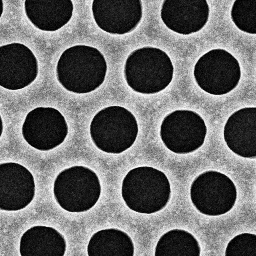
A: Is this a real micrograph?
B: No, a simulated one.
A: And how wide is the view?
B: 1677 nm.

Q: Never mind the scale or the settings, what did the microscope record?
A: a regular array of holes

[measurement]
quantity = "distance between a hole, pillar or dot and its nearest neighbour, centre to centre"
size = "446 nm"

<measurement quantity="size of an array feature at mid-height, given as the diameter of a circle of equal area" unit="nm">308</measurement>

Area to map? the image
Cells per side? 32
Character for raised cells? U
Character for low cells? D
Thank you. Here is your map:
UUUDDDDDDUUUDDDDDDUUDDDDDDUUUDDD
UUUDDDDDDUUUDDDDDDUUDDDDDDUUUDDD
UUUUDDDDDUUUDDDDDDUUDDDDDDUUUDDD
UUUUUDDUUUUUUDDDDUUUUDDDDUUUUUDD
UUUUUUUUUUUUUUUUUUUUUUUUUUUUUUUU
UDDUUUUUUUUUUUUUUUUUUUUUUUUUUUUU
DDDDUUUUDDDDUUUUUDDDDUUUUUDDUUUU
DDDDDUUDDDDDDUUUDDDDDUUUUDDDDDUU
DDDDDUUDDDDDDUUUDDDDDDUUDDDDDDUU
DDDDDUUDDDDDDUUUDDDDDDUUDDDDDDUU
DDDDUUUUDDDDDUUUDDDDDUUUUDDDDDUU
UUUUUUUUUDDUUUUUUDDDUUUUUUDDDUUU
UUUUUUUUUUUUUUUUUUUUUUUUUUUUUUUU
UUUUUDDUUUUUUDDDUUUUUUUUUUUUUUUD
UUUDDDDDUUUUDDDDDUUUUDDDDUUUUDDD
UUUDDDDDUUUDDDDDDUUUDDDDDDUUDDDD
UUUDDDDDUUUDDDDDDUUUDDDDDDUUDDDD
UUUDDDDDUUUUDDDDDUUUDDDDDDUUDDDD
UUUUDDDUUUUUDDDDUUUUUDDDDUUUUDDD
UUUUUUUUUUUUUUUUUUUUUUUUUUUUUUDD
DDUUUUUUUUUUUUUUUUUUUUUUUUUUUUUU
DDDDUUUUDDDDUUUUDDDDUUUUUUDUUUUU
DDDDUUUDDDDDUUUDDDDDDUUUDDDDDUUU
DDDDUUUDDDDDDUUDDDDDDUUUDDDDDUUU
DDDDUUUDDDDDUUUDDDDDDUUUDDDDDDUU
DDDDUUUDDDDDUUUUDDDDDUUUDDDDDUUU
UUUUUUUUUDUUUUUUUDDUUUUUUDDDUUUU
UUUUUUUUUUUUUUUUUUUUUUUUUUUUUUUU
UUUUDDUUUUUUUUUUUUUUUUUUUUUUUUUU
UUUDDDDDUUUUDDDDUUUUDDDDUUUUUDDD
UUDDDDDDUUUDDDDDDUUUDDDDDUUUUDDD
UUUDDDDDUUUDDDDDDUUDDDDDDUUUDDDD